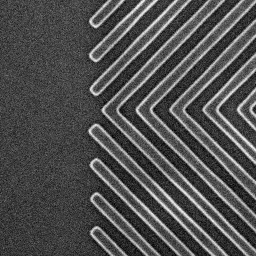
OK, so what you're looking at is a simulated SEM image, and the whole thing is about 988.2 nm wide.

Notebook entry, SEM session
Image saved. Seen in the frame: groups of lines, slits or small figures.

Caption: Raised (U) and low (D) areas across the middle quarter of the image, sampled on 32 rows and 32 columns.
DDDDDDDDDDDDUUUDDDDDUUUUDDDDUUUU
DDDDDDDDDDDUUUUDDDDUUUUDDDDUUUUD
DDDDDDDDDDUUUUDDDDUUUUDDDDUUUUDD
DDDDDDDDDUUUUDDDDUUUUDDDDUUUUDDD
DDDDDDDDUUUUDDDDUUUUDDDDUUUUUDDD
DDDDDDDUUUUDDDDUUUUDDDDUUUUUDDDD
DDDDDDDUUUDDDDUUUUDDDDUUUUUDDDDU
DDDDDDDUUDDDDUUUUDDDDDUUUUDDDDUU
DDDDDDDDDDDDUUUUDDDDDUUUUDDDDUUU
DDDDDDDDDDDUUUUDDDDDUUUUDDDDUUUU
DDDDDDDDDDUUUUDDDDDUUUUDDDDUUUUD
DDDDDDDDDDUUUDDDDDUUUUDDDDDUUUDD
DDDDDDDDDDUUUUDDDDDUUUDDDDDUUUUD
DDDDDDDDDDDUUUUDDDDUUUUDDDDDUUUU
DDDDDDDDDDDDUUUUDDDDUUUUDDDDDUUU
DDDDDDDUUDDDDUUUUDDDDUUUUDDDDDUU
DDDDDDUUUUDDDDUUUUDDDDUUUUDDDDDU
DDDDDDDUUUUDDDDUUUUDDDDUUUUUDDDD
DDDDDDDDUUUUDDDDUUUUDDDDUUUUUDDD
DDDDDDDDDUUUUDDDDUUUUDDDDUUUUUDD
DDDDDDDDDDUUUUDDDDUUUUDDDDDUUUUD
DDDDDDDDDDDUUUUDDDDUUUUDDDDDUUUU
DDDDDDDDDDDDUUUUDDDDUUUUDDDDDUUU
DDDDDDDDDDDDDUUUUDDDDUUUUDDDDDUU
DDDDDDDUUDDDDDUUUUDDDDUUUUDDDDDU
DDDDDDDUUUDDDDDUUUUDDDDUUUUDDDDD
DDDDDDDUUUUDDDDDUUUUDDDDUUUUDDDD
DDDDDDDDUUUUDDDDDUUUUDDDDUUUUDDD
DDDDDDDDDUUUUDDDDDUUUUDDDDUUUUDD
DDDDDDDDDDUUUUDDDDDUUUUDDDDUUUUD
DDDDDDDDDDDUUUUDDDDDUUUUDDDDUUUU
DDDDDDDDDDDDUUUUDDDDDUUUUDDDDUUU